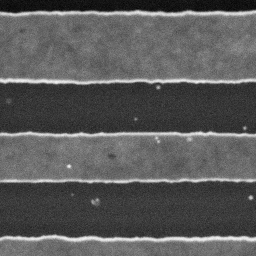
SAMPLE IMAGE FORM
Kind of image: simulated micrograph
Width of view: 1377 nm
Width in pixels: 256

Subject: lines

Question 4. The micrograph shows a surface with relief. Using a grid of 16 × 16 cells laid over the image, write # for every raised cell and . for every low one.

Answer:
................
################
################
################
################
................
................
................
################
################
################
................
................
................
................
################